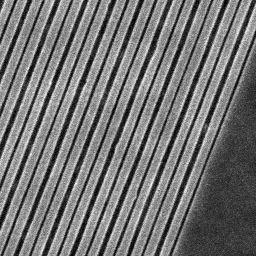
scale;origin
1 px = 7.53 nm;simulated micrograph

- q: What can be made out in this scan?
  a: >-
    parallel lines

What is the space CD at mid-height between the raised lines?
32.5 nanometers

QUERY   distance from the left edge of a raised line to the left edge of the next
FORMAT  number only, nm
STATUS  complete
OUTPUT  99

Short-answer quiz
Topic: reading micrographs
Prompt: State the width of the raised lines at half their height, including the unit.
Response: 64.2 nm